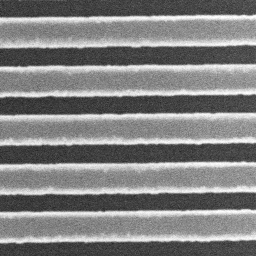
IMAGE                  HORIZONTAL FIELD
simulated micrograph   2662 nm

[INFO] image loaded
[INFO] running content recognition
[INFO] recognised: lines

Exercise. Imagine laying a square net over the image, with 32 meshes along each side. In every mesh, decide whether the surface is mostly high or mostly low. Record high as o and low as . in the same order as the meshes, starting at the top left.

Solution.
................................
................................
.ooooooooooooooooooooooooooooooo
oooooooooooooooooooooooooooooooo
oooooooooooooooooooooooooooooooo
oooooooooooooo..oooo.o...o......
................................
................................
.....ooooooooooooooooooooooooooo
oooooooooooooooooooooooooooooooo
oooooooooooooooooooooooooooooooo
oooooooooooooooooooooooooooooooo
................................
................................
................oooooooooooooooo
oooooooooooooooooooooooooooooooo
oooooooooooooooooooooooooooooooo
oooooooooooooooooooooooooooooooo
................................
................................
.............................ooo
oooooooooooooooooooooooooooooooo
oooooooooooooooooooooooooooooooo
oooooooooooooooooooooooooooooooo
................................
................................
.......................ooooooooo
oooooooooooooooooooooooooooooooo
oooooooooooooooooooooooooooooooo
oooooooooooooooooooooooooooooooo
................................
................................